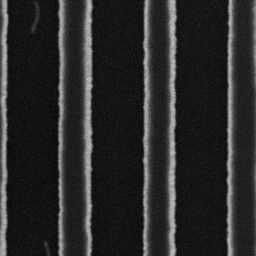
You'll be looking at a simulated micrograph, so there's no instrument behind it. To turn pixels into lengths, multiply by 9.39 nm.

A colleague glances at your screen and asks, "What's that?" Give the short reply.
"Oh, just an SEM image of lines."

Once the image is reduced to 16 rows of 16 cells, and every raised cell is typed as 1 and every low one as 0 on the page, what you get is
0000110001100011
0000110001100011
0000110001100011
0000110001100011
0000110001100011
0000110001100011
0000110001100011
0000110001100011
0000110001100011
0000110001100011
0000110001100011
0000110001100011
0000110001100011
0000110001100011
0000110001100011
0000110001100011